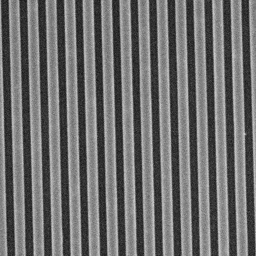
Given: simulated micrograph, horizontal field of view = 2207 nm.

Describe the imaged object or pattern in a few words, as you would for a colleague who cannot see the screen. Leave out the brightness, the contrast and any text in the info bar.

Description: parallel lines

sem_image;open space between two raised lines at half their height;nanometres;66.8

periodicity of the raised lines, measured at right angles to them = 0.159 um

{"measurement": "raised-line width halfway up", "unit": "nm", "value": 91.6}